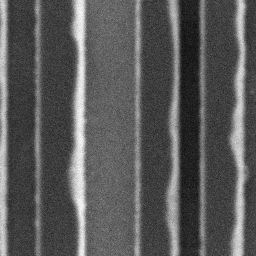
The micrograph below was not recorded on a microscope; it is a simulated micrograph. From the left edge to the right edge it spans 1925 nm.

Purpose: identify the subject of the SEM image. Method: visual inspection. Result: lines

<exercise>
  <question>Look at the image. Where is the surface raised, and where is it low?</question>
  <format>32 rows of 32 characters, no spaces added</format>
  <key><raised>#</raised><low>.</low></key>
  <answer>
#....#####.......#####...#####..
#....#####.......#####...#####..
#....#####.......#####...#####..
#....#####.......#####...#####..
#....#####.......#####...#####..
#....#####.......#####...#####..
#....#####.......#####...#####..
#....#####.......#####...#####..
#....#####.......#####...#####..
#....#####.......#####...#####..
#....#####.......#####...#####..
#....#####.......#####...#####..
#....#####.......#####...#####..
#....#####.......#####...#####..
#....#####.......#####...#####..
#....#####.......#####...#####..
#....#####.......#####...#####..
#....#####.......#####...#####..
#....#####.......#####...#####..
#....#####.......#####...#####..
.....#####.......#####...#####..
#....#####.......#####...#####..
#....#####.......#####...#####..
#....#####.......#####...#####..
.....#####.......#####...#####..
.....#####.......#####...#####..
#....#####.......#####...#####..
#....#####.......#####...#####..
.....#####.......#####...#####..
#....#####.......#####...#####..
#....#####.......#####...#####..
#....#####.......#####...#####..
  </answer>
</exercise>